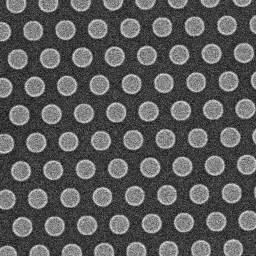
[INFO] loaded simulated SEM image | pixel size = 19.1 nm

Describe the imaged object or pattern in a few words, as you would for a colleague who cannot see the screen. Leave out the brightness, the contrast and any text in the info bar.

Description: an array of small figures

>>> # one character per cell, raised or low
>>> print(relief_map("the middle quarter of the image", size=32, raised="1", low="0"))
00011100000000000000000000000000
00000000000000000000000000000000
00000000000000000000000011000000
11000001110000011110000111100001
11100001111000011110000111100001
11100001111000011110000111100001
11100001111000011110000111100000
11000000110000000000000000000000
00000000000000000000000000000000
00000000000000000000000000000100
00011100000111100001111000011110
00011110000111100001111000011111
00011110000111100001111000011110
00011110000111100001111000001110
00001100000000000000000000000000
00000000000000000000000000000000
00000000000000000000000000000000
11100000111000001110000111100001
11100001111000011111000111110001
11100001111100011111000111110001
11100001111000001110000011100000
11000000000000000000000000000000
00000000000000000000000000000000
00000000000000000000000000000100
00001110000011100000111000011111
00011111000111110001111100011111
00011111000111110001111100001111
00011110000011100000111000001110
00000100000000000000000000000000
00000000000000000000000000000000
00000000000000000000000001000000
11100000111000001111000011110000